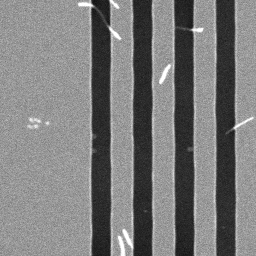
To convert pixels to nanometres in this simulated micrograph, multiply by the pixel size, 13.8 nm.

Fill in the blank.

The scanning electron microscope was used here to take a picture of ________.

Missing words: groups of lines, slits or small figures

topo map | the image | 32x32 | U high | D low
UUUUUUUUUUUUDDUUUDDUUUDDUUUDDUUU
UUUUUUUUUUUDDDUUUDDUUUDDUUUDDUUU
UUUUUUUUUUUDDDUUUDDUUUDDUUUDDUUU
UUUUUUUUUUUDDDUUUDDUUUDDUUUDDUUU
UUUUUUUUUUUDDDUUUDDUUUDDUUUDDUUU
UUUUUUUUUUUDDDUUUDDUUUDDUUUDDUUU
UUUUUUUUUUUDDDUUUDDUUUDDUUUDDUUU
UUUUUUUUUUUDDDUUUDDUUUDDUUUDDUUU
UUUUUUUUUUUDDDUUUDDUUUDDUUUDDUUU
UUUUUUUUUUUDDDUUUDDUUUDDUUUDDUUU
UUUUUUUUUUUDDDUUUDDUUUDDUUUDDUUU
UUUUUUUUUUUDDDUUUDDUUUDDUUUDDUUU
UUUUUUUUUUUDDDUUUDDUUUDDUUUDDUUU
UUUUUUUUUUUDDDUUUDDUUUDDUUUDDUUU
UUUUUUUUUUUDDDUUUDDUUUDDUUUDDUUU
UUUUUUUUUUUDDDUUUDDUUUDDUUUDDUUU
UUUUUUUUUUUDDDUUUDDUUUDDUUUDDUUU
UUUUUUUUUUUDDDUUUDDUUUDDUUUDDUUU
UUUUUUUUUUUDDDUUUDDUUUDDUUUDDUUU
UUUUUUUUUUUDDDUUUDDUUUDDUUUDDUUU
UUUUUUUUUUUDDDUUUDDUUUDDUUUDDUUU
UUUUUUUUUUUDDDUUUDDUUUDDUUUDDUUU
UUUUUUUUUUUDDDUUUDDUUUDDUUUDDUUU
UUUUUUUUUUUDDDUUUDDUUUDDUUUDDUUU
UUUUUUUUUUUDDDUUUDDUUUDDUUUDDUUU
UUUUUUUUUUUDDDUUUDDUUUDDUUUDDUUU
UUUUUUUUUUUDDDUUUDDUUUDDUUUDDUUU
UUUUUUUUUUUDDDUUUDDUUUDDUUUDDUUU
UUUUUUUUUUUDDDUUUDDUUUDDUUUDDUUU
UUUUUUUUUUUDDDUUUDDUUUDDUUUDDUUU
UUUUUUUUUUUDDDUUUDDUUUDDUUUDDUUU
UUUUUUUUUUUDDDUUUDDUUUDDUUUDDUUU